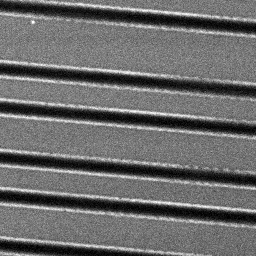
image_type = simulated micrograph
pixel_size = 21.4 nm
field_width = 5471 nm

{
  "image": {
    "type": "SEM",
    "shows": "lines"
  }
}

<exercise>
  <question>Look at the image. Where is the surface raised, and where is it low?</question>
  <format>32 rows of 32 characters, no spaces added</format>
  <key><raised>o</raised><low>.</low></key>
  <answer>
oooooooooo......................
oooooooooooooooooooo............
.........oooooooooooooooooooooo.
....................oooooooooooo
...............................o
................................
................................
................................
oooooooooo......................
ooooooooooooooooooooo...........
..........oooooooooooooooooooooo
......................oooooooooo
o...............................
oooooooooooo....................
oooooooooooooooooooooooo........
............oooooooooooooooooooo
.......................ooooooooo
................................
................................
oooooooo........................
oooooooooooooooooooo............
.........oooooooooooooooooooooo.
....................oooooooooooo
..............................oo
ooooooooooo.....................
ooooooooooooooooooooooo.........
...........ooooooooooooooooooooo
......................oooooooooo
................................
................................
ooooooooo.......................
oooooooooooooooooooo............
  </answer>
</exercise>